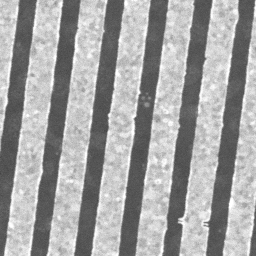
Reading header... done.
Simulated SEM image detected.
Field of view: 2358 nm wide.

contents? parallel lines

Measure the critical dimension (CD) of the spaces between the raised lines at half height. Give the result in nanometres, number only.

169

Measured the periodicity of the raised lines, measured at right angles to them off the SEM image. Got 400 nanometres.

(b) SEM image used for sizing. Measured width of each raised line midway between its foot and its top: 231 nm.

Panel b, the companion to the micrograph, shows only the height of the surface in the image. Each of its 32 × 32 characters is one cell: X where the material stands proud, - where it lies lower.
XX---XXX--XXX---XXX--XXX---XXX--
XX--XXXX--XXX--XXXX--XXX--XXXX--
XX--XXX---XXX--XXX---XXX--XXXX--
XX--XXX---XXX--XXX---XXX--XXX---
XX--XXX---XXX--XXX---XXX--XXX--X
XX--XXX--XXXX--XXX--XXXX--XXX--X
X---XXX--XXX---XXX--XXX---XXX--X
X---XXX--XXX---XXX--XXX---XXX--X
X---XXX--XXX---XXX--XXX--XXXX--X
X--XXXX--XXX--XXXX--XXX--XXXX--X
X--XXXX--XXX--XXX---XXX--XXX---X
X--XXX---XXX--XXX---XXX--XXX---X
X--XXX---XXX--XXX--XXXX--XXX--XX
X--XXX--XXXX--XXX--XXX---XXX--XX
---XXX--XXX---XXX--XXX---XXX--XX
---XXX--XXX---XXX--XXX---XXX--XX
---XXX--XXX---XXX--XXX--XXXX--XX
--XXXX--XXX--XXXX--XXX--XXX---XX
--XXX---XXX--XXX---XXX--XXX---XX
--XXX---XXX--XXX---XXX--XXX---XX
--XXX--XXXX--XXX---XXX--XXX--XXX
--XXX--XXXX--XXX--XXXX--XXX--XXX
--XXX--XXX---XXX--XXX---XXX--XXX
--XXX--XXX---XXX--XXX---XXX--XXX
--XXX--XXX---XXX--XXX--XXXX--XXX
-XXXX--XXX--XXX---XXX--XXX---XXX
-XXX---XXX--XXX---XXX--XXX---XXX
-XXX---XXX--XXX---XXX--XXX---XXX
-XXX--XXXX--XXX--XXXX--XXX--XXXX
-XXX--XXXX--XXX--XXXX--XXX--XXX-
-XXX--XXX---XXX--XXX---XXX--XXX-
-XXX--XXX---XXX--XXX---XXX--XXX-